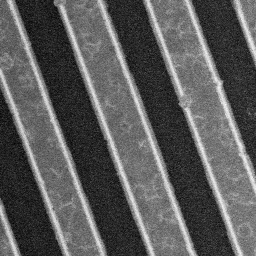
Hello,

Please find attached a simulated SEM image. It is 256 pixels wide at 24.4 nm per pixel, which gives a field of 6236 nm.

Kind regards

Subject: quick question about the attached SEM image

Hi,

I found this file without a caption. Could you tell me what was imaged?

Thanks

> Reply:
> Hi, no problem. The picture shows one or a few lines or trenches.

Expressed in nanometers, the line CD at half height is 884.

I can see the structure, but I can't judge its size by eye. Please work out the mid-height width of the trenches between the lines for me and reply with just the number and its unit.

1130 nanometers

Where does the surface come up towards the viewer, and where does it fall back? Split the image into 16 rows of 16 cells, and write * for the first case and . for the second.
*...**...***...*
*...***...**...*
**...**...***...
**...**....**...
**...***...**...
***...**...***..
.**...***..***..
.**...***...**..
..**...**...***.
..**...***...**.
..**....**...**.
...**...**...***
...**...***...**
...***...**...**
*...**...***...*
*...**...***...*